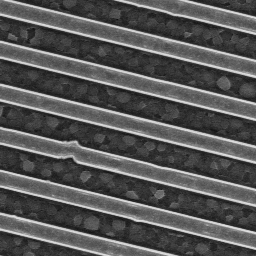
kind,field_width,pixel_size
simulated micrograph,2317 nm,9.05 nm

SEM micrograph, parallel lines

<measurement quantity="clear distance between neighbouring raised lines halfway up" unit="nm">233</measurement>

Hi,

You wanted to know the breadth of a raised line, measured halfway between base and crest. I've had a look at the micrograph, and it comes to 142 nanometres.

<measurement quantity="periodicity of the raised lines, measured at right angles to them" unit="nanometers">378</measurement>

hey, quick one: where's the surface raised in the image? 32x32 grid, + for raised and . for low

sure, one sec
+++..............++++++++.......
+++++++..............++++++++...
...++++++++..............+++++++
.......++++++++..............+++
...........++++++++.............
+..............+++++++++........
+++++..............+++++++++....
.++++++++..............+++++++++
.....++++++++..............+++++
.........+++++++++.............+
..............++++++++..........
++++..............++++++++......
++++++++..............++++++++..
....++++++++..............++++++
........++++++++..............++
............++++++++............
+++.............++++++++........
+++++++.............+++++++++...
..+++++++++.............++++++++
......+++++++++..............+++
..........+++++++++.............
+.............+++++++++.........
+++++..............++++++++.....
.++++++++..............++++++++.
.....++++++++..............+++++
.........++++++++..............+
.............++++++++...........
+++..............++++++++.......
++++++++.............++++++++...
...+++++++++.............+++++++
.......+++++++++.............+++
...........+++++++++............